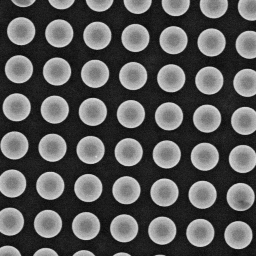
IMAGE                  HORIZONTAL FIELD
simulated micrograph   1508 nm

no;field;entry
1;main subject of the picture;an array of small figures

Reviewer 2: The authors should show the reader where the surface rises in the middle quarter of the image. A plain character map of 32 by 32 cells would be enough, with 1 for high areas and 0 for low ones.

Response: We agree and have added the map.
10000111111000011111000001110000
11001111111000111111000011111100
11001111111000111111100011111100
10000111111000111111100111111100
10000111111000111111000111111100
00000011100000011111000011111100
00000000000000000000000001111000
00000000000000000000000000000000
00000000000000000000000000000000
00000111110000011100000000000000
10001111110000111111000011111000
10001111111000111111000111111000
10001111111001111111000111111100
10001111110001111111000111111100
00000111100000111111000111111000
00000000000000011100000011111000
00000000000000000000000000000000
00000000000000000000000000000000
00000111000000000000000000000000
00001111100000111100000011100000
10011111110001111110000111110000
10011111110001111110001111111000
00011111110001111110001111111000
00001111100001111110001111111000
00000111000000111110000111111000
00000000000000001000000011100000
00000000000000000000000000000000
00000000000000000000000000000000
00001111100000111000000000000000
00011111100001111100000111100000
00011111100011111110001111110000
00011111100011111110001111111001